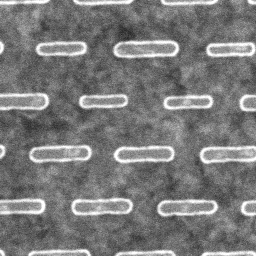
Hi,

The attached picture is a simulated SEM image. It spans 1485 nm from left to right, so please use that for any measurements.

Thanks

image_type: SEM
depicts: a regular array of holes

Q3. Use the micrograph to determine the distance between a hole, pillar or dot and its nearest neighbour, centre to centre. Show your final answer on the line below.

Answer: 0.389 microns